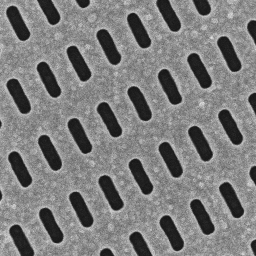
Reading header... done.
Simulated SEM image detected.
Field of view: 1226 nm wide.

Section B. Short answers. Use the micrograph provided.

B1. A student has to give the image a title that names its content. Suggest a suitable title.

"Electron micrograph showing a regular array of holes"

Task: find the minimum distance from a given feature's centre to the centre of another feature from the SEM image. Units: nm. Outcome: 163